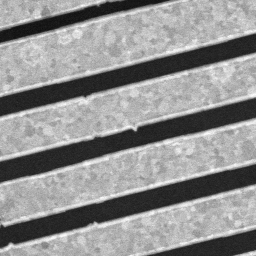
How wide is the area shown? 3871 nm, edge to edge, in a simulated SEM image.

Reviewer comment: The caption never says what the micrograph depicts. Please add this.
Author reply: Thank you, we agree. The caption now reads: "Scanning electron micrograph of one or a few lines or trenches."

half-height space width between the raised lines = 359 nanometers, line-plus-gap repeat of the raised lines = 979 nanometers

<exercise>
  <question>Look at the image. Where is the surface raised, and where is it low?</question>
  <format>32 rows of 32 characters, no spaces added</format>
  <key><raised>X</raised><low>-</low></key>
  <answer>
XXXXXXXXXXXX--------XXXXXXXXXXXX
XXXXXXXX--------XXXXXXXXXXXXXXXX
XXXX--------XXXXXXXXXXXXXXXXXXXX
--------XXXXXXXXXXXXXXXXXXXXXXXX
-----XXXXXXXXXXXXXXXXXXXXXXXX---
XXXXXXXXXXXXXXXXXXXXXXXXX-------
XXXXXXXXXXXXXXXXXXXXXX----------
XXXXXXXXXXXXXXXXXX------------XX
XXXXXXXXXXXXXX------------XXXXXX
XXXXXXXXXX------------XXXXXXXXXX
XXXXX-------------XXXXXXXXXXXXXX
X-------------XXXXXXXXXXXXXXXXXX
----------XXXXXXXXXXXXXXXXXXX---
------XXXXXXXXXXXXXXXXXXX-------
--XXXXXXXXXXXXXXXXXXX-----------
XXXXXXXXXXXXXXXXXX------------XX
XXXXXXXXXXXXXX------------XXXXXX
XXXXXXXXX-------------XXXXXXXXXX
XXXXX-------------XXXXXXXXXXXXXX
X-------------XXXXXXXXXXXXXXXXXX
-----------XXXXXXXXXXXXXXXXXXXX-
-------XXXXXXXXXXXXXXXXXXX------
---XXXXXXXXXXXXXXXXXXX----------
XXXXXXXXXXXXXXXXXX-------------X
XXXXXXXXXXXXXX-------------XXXXX
XXXXXXXXXX-------------XXXXXXXXX
XXXXXXX------------XXXXXXXXXXXXX
XXX------------XXXXXXXXXXXXXXXXX
-----------XXXXXXXXXXXXXXXXXXXX-
-------XXXXXXXXXXXXXXXXXXXX-----
---XXXXXXXXXXXXXXXXXXXX---------
XXXXXXXXXXXXXXXXXXX-------------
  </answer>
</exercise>